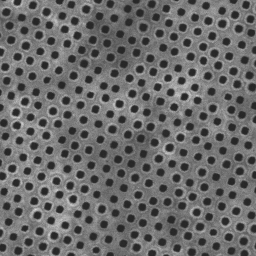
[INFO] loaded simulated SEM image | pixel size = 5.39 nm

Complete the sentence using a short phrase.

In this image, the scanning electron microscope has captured a regular array of holes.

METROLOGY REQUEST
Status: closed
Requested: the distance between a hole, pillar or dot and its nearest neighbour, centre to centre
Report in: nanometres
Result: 74.3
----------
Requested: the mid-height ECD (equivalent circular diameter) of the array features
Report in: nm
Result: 40.8